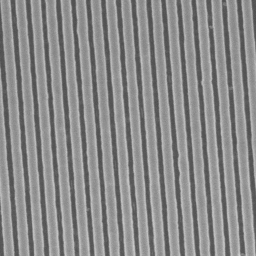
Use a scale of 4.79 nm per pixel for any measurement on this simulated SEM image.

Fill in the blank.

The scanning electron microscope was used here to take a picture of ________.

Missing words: parallel lines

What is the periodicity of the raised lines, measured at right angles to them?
71.9 nm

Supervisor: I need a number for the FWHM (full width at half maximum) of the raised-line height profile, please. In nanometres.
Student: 45.3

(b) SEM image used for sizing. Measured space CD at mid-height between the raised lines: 29.2 nanometers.